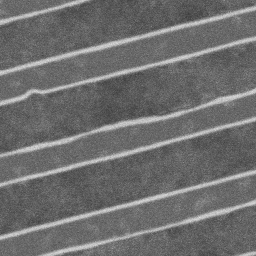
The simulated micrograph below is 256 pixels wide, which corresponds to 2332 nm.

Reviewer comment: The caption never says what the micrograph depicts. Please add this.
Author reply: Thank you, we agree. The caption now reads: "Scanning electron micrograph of one or a few lines or trenches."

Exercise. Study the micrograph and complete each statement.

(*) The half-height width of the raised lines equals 269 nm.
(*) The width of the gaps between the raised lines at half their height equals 0.46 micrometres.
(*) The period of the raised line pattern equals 79.7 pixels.